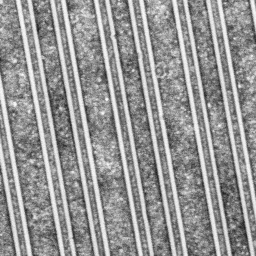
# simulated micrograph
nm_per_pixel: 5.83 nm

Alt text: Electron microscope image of parallel lines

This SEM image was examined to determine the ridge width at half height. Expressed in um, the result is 0.0632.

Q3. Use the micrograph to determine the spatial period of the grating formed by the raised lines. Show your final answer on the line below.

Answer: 0.221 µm